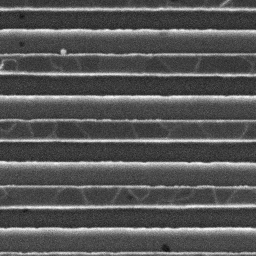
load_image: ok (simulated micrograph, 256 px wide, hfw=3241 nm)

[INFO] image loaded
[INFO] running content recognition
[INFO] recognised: lines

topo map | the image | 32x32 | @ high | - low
@@@@@@@@@@@@@@@@@@@@@@@@@@@@@@@@
--------------------------------
--------------------------------
--------------------------------
@@@@@@@@@@@@@@@@@@@@@@@@@@@@@@@@
@@@@@@@@@@@@@@@@@@@@@@@@@@@@@@@@
@@@@@@@@@@@@@@@@@@@@@@@@@@@@@@@@
@@@@@@@@@@@@@@@@@@@@@@@@@@@@@@@@
@@@@@@@@@@@@@@@@@@@@@@@@@@@@@@@@
--------------------------------
--------------------------------
--------------------------------
@@@@@@@@@@@@@@@@@@@@@@@@@@@@@@@@
@@@@@@@@@@@@@@@@@@@@@@@@@@@@@@@@
@@@@@@@@@@@@@@@@@@@@@@@@@@@@@@@@
@@@@@@@@@@@@@@@@@@@@@@@@@@@@@@@@
@@@@@@@@@@@@@@@@@@@@@@@@@@@@@@@@
---@@---@@@@@-@@---@@-----------
--------------------------------
--------------------------------
@@@@@@@@@@@@@@@@@@@@@@@@@@@@@@@@
@@@@@@@@@@@@@@@@@@@@@@@@@@@@@@@@
@@@@@@@@@@@@@@@@@@@@@@@@@@@@@@@@
@@@@@@@@@@@@@@@@@@@@@@@@@@@@@@@@
@@@@@@@@@@@@@@@@@@@@@@@@@@@@@@@@
@@@@@@@@@@@@@@@@@@@@@@@@@@@@@@@@
--------------------------------
--------------------------------
--------------------------------
@@@@@@@@@@@@@@@@@@@@@@@@@@@@@@@@
@@@@@@@@@@@@@@@@@@@@@@@@@@@@@@@@
@@@@@@@@@@@@@@@@@@@@@@@@@@@@@@@@